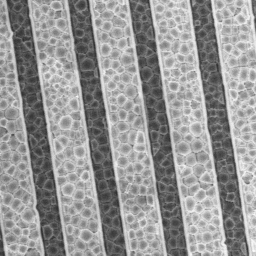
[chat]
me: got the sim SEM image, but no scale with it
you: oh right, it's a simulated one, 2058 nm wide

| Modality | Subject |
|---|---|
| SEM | parallel lines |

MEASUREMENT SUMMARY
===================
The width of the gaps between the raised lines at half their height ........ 186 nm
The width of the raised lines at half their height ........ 298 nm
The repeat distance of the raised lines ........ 481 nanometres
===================